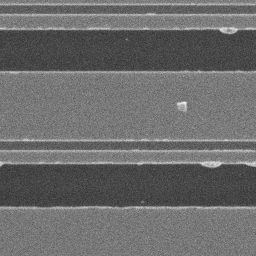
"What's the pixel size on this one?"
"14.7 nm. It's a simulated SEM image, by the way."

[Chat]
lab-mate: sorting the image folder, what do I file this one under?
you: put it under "lines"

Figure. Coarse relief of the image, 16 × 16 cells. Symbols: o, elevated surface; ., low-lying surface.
oooooooooooooooo
oooooooooooooooo
................
................
oooooooooooooooo
oooooooooooooooo
oooooooooooooooo
oooooooooooooooo
oooooooooooooooo
oooooooooooooooo
................
................
................
oooooooooooooooo
oooooooooooooooo
oooooooooooooooo